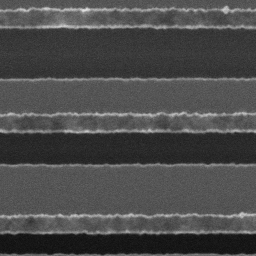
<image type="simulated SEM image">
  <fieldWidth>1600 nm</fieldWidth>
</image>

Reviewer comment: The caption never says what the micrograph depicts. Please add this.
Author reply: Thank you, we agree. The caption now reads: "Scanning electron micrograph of lines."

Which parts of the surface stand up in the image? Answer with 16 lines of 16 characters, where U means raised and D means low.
UUUUUUUUUUUUUUUU
UUUUUUUUUUUUUUUU
DDDDDDDDDDDDDDDD
DDDDDDDDDDDDDDDD
DDDDDDDDDDDDDDDD
UUUUUUUUUUUUUUUU
UUUUUUUUUUUUUUUU
UUUUUUUUUUUUUUUU
DDDDDDDDDDDDDDDD
DDDDDDDDDDDDDDDD
UUUUUUUUUUUUUUUU
UUUUUUUUUUUUUUUU
UUUUUUUUUUUUUUUU
UUUUUUUUUUUUUUUU
UUUUUUUUUUUUUUUU
DDDDDDDDDDDDDDDD